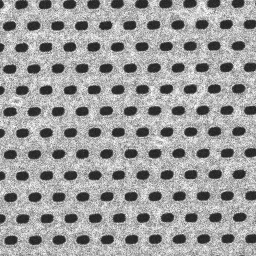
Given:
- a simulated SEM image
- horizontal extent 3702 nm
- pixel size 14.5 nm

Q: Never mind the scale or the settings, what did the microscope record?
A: a regular array of holes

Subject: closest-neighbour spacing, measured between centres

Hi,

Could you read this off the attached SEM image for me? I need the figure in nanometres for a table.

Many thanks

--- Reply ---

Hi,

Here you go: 346